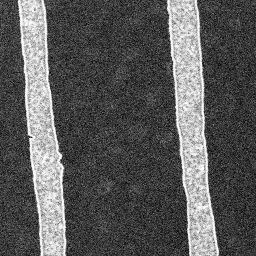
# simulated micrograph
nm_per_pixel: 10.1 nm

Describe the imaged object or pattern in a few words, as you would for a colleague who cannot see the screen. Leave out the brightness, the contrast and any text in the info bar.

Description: one or a few lines or trenches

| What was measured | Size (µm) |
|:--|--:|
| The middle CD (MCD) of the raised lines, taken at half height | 0.256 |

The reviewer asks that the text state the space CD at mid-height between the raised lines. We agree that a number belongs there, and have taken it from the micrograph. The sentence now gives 1260 nanometres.